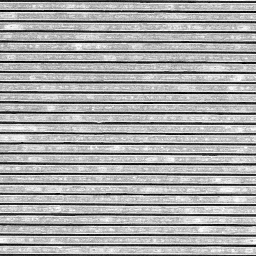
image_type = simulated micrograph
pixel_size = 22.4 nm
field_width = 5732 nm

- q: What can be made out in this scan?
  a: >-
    parallel lines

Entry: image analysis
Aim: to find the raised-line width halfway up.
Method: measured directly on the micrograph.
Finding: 160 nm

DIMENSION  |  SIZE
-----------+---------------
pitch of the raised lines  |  0.227 µm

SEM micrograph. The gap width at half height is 58.8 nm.